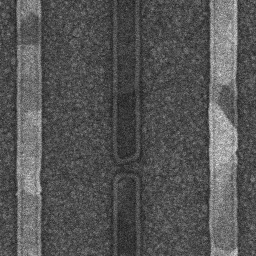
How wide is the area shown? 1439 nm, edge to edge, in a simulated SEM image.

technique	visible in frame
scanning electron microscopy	one or a few lines or trenches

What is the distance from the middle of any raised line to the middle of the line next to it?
546 nm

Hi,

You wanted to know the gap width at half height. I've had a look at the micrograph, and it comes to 0.42 um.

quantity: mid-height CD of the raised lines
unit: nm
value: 130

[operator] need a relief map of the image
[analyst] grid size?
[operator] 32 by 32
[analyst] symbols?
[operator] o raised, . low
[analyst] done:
..ooo.........ooo.........ooo...
..ooo.........ooo..........oo...
..ooo.........ooo..........oo...
..ooo..........oo.........ooo...
..ooo.........ooo..........oo...
..ooo.........ooo.........ooo...
..ooo.........ooo.........ooo...
..ooo.........ooo..........oo...
..ooo.........ooo.........ooo...
..ooo.........ooo.........ooo...
..ooo.........ooo.........ooo...
..ooo.........ooo.........ooo...
..ooo.........ooo.........ooo...
..ooo.........ooo.........ooo...
..ooo.........ooo.........ooo...
..ooo.........ooo.........ooo...
..ooo.........ooo.........ooo...
..ooo.........ooo.........ooo...
..ooo.........ooo.........ooo...
..ooo..........oo.........ooo...
..ooo.....................ooo...
..ooo.....................ooo...
..ooo..........oo.........ooo...
..ooo.........ooo.........ooo...
..ooo.........ooo.........ooo...
..ooo.........ooo.........ooo...
..ooo.........ooo.........ooo...
..ooo.........ooo.........ooo...
..ooo.........ooo.........ooo...
..ooo.........ooo.........ooo...
..ooo.........ooo..........oo...
..ooo.........ooo..........oo...